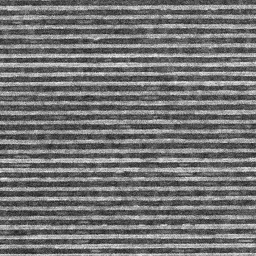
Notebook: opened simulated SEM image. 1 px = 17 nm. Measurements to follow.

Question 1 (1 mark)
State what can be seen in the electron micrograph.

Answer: parallel lines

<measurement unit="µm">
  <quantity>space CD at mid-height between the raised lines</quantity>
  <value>0.109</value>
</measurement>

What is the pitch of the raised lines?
9.54 pixels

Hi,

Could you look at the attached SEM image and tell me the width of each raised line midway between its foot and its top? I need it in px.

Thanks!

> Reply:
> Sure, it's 3.25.